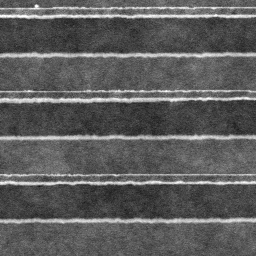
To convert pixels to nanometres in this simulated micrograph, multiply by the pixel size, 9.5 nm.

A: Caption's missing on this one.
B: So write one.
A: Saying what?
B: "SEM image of lines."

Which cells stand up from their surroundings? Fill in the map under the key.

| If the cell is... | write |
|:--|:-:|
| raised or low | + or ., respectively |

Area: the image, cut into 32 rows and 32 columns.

++++++++++++++++++++++++++++++++
++++++++++++++++++++++++++++++++
................................
................................
................................
................................
................................
++++++++++++++++++++++++++++++++
++++++++++++++++++++++++++++++++
++++++++++++++++++++++++++++++++
++++++++++++++++++++++++++++++++
++++++++++++++++++++++++++++++++
+++++++++++++++++....+..........
................................
................................
................................
................................
++++++++++++++++++++++++++++++++
++++++++++++++++++++++++++++++++
++++++++++++++++++++++++++++++++
++++++++++++++++++++++++++++++++
++++++++++++++++++++++++++++++++
++++++++++++++++++++++++++++++++
................................
................................
................................
................................
................................
++++++++++++++++++++++++++++++++
++++++++++++++++++++++++++++++++
++++++++++++++++++++++++++++++++
++++++++++++++++++++++++++++++++